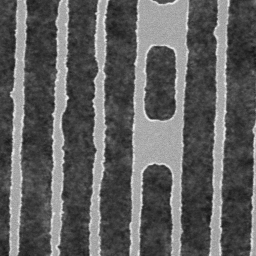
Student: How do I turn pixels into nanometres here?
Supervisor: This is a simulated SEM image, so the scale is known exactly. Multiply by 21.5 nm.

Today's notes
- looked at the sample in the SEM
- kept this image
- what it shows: parallel lines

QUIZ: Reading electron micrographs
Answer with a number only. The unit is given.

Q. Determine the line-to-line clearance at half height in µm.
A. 0.678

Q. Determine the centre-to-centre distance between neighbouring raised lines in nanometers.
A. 865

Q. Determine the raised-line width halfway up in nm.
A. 196